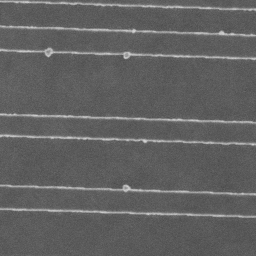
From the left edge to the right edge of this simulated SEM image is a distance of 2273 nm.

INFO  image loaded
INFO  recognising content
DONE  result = lines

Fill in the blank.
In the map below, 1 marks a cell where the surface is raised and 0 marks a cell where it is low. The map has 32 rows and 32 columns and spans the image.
00000000111111111111111111111111
00000000000000000000000000000000
00000000000000000000000000000000
11111111000000000000000000000000
11111111111111111111111111111111
11111111111111111111111111111111
00000111111111111111111111111111
00000000000000000000000000000000
00000000000000000000000000000000
00000000000000000000000000000000
00000000000000000000000000000000
00000000000000000000000000000000
00000000000000000000000000000000
00000000000000000000000000000000
11111000000000000000000000000000
11111111111111111111111111111111
11111111111111111111111111111111
00000000000000001111111111111111
00000000000000000000000000000000
00000000000000000000000000000000
00000000000000000000000000000000
00000000000000000000000000000000
00000000000000000000000000000000
11111111100000010000000000000000
11111111111111111111111111111111
11111111111111111111111111111111
00000000000011111111111111111111
00000000000000000000000000000000
00000000000000000000000000000000
00000000000000000000000000000000
00000000000000000000000000000000
00000000000000000000000000000000